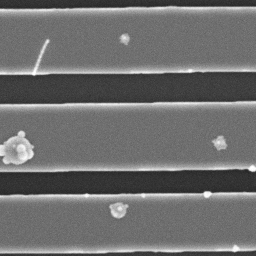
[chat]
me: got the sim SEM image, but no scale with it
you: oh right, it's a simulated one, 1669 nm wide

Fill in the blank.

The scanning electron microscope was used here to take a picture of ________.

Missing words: lines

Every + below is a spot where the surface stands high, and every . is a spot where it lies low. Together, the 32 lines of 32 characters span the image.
................................
++++++++++++++++++++++++++++++++
++++++++++++++++++++++++++++++++
++++++++++++++++++++++++++++++++
++++++++++++++++++++++++++++++++
++++++++++++++++++++++++++++++++
++++++++++++++++++++++++++++++++
++++++++++++++++++++++++++++++++
++++++++++++++++++++++++++++++++
................................
................................
................................
................................
++++++++++++++++++++++++++++++++
++++++++++++++++++++++++++++++++
++++++++++++++++++++++++++++++++
++++++++++++++++++++++++++++++++
++++++++++++++++++++++++++++++++
++++++++++++++++++++++++++++++++
++++++++++++++++++++++++++++++++
++++++++++++++++++++++++++++++++
................................
................................
................................
.++.++++++++++++++++++++++++++++
++++++++++++++++++++++++++++++++
++++++++++++++++++++++++++++++++
++++++++++++++++++++++++++++++++
++++++++++++++++++++++++++++++++
++++++++++++++++++++++++++++++++
++++++++++++++++++++++++++++++++
++++++++++++++..................